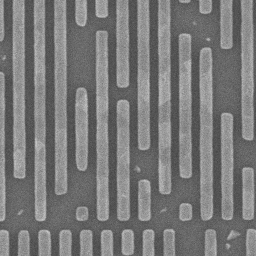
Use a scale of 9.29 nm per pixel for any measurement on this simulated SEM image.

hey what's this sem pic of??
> wiring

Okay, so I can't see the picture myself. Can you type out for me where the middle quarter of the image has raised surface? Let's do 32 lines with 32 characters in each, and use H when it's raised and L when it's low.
LLLLLLLLHHHLLHHHLLLHHLLLHHLLLHHH
LLLLLLLLHHHLLHHHLLLHHLLLHHLLLHHH
LLLLLLLLHHHLLHHHLLLHHLLLHHLLLHHH
LLLLLLLLHHHLLHHHLLHHHLLLHHLLLHHH
LLLLLLLLHHHLLHHHLLHHHLLLHHLLLHHH
LLLLLLLLHHHLLLHHLLLHHLLLHHLLLHHH
LLLHHLLLHHHLLLLLLLLHHLLLHHLLLHHH
LLLHHHLLHHHLLLLLLLLHHLLLHHLLLHHH
LLLHHHLLHHHLLLLLLLLHHLLLHHLLLHHH
LLLHHHLLHHHLLLHHLLLHHLLLHHLLLHHH
LLLHHHLLHHHLLHHHLLLHHLLLHHLLLHHH
LLLHHHLLHHHLLHHHLLLHHLLLHHLLLHHH
LLLHHHLLHHHLLHHHLLLHHLLLHHLLLHHH
LLLHHHLLHHHLLHHHLLLHHLLLHHLLLHHH
LLLHHHLLHHHLLHHHLLLHHLLLHHLLLHHH
LLLHHHLLHHHLLHHHLLLHHLLLHHLLLHHH
LLLHHHLLHHHLLHHHLLLHHLLLHHLLLHHH
LLLHHHLLHHHLLHHHLLLHHLLLHHLLLHHH
LLLHHHLLHHHLLHHHLLLHHLLLHHHLLHHH
LLLHHHLLHHHLLHHHLLLHHLLLHHLLLHHH
LLLHHHLLHHHLLHHHLLLHHLLLHHLLLHHH
LLLHHHLLHHHLLHHHLLLLLLLLHHLLLHHH
LLLHHHLLHHHLLHHHLLLLLLLLHHLLLHHH
LLLHHHLLHHHLLHHHLLLLLLLLHHLLLHHH
LLLHHHLLHHHLLHHHLLLLLLLLHHLLLHHH
LLLHHHLLHHHLLHHHLLLLLLLLHHLLLHHH
LLLLHLLLHHHLLHHHLLLLLLLLHHLLLHHH
LLLLLLLLHHHLLHHHLLLLLLLLHHLLLHHH
LLLLLLLLHHHLLHHHLLLLLLLLHHLLLLLL
LLLLLLLLHHHLLHHHLLLHHLLLHHHLLLLL
LLLLLLLLHHHLLHHHLLLHHLLLHHHLLLLL
LLLLLLLLHHHLLHHHLLLHHLLLHHLLLLLL